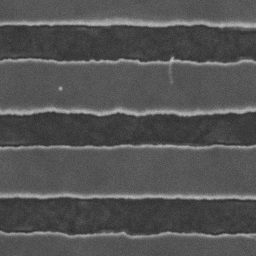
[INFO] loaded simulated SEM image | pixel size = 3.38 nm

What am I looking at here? lines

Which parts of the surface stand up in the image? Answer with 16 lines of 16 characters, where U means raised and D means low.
UUUUUUUUUUUUUUUU
UUUUUUUUUUUUUUUU
DDDDDDDDDDDDDDDD
DDDDDDDDDDDDDDDD
UUUUUUUUUUUUUUUU
UUUUUUUUUUUUUUUU
UUUUUUUUUUUUUUUU
DDDDDDDDDDDDDDDD
DDDDDDDDDDDDDDDD
UUUUUUUUUUUUUUUU
UUUUUUUUUUUUUUUU
UUUUUUUUUUUUUUUU
DDDDDDDDDDDDDDDD
DDDDDDDDDDDDDDDD
DDDDDDDDDDDDDDDD
UUUUUUUUUUUUUUUU